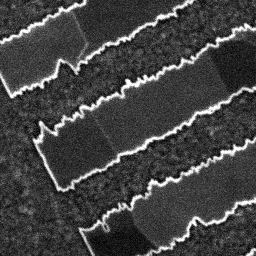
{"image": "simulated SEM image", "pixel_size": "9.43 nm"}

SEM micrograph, one or a few lines or trenches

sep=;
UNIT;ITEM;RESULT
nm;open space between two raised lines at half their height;414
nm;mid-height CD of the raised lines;526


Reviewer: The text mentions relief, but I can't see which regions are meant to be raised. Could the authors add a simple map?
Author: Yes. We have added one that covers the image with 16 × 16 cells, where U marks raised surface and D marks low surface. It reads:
DDDDUUUUUUUDDDDD
DDUUUUUUUDDDDDDD
UUUUUUUUDDDDDDUU
UUUUUUDDDDDDUUUU
UUUUDDDDDDUUUUUU
UUDDDDDDUUUUUUUU
DDDDDDUUUUUUUUDD
DDDDUUUUUUUUDDDD
DDUUUUUUUUDDDDDD
DDUUUUUUDDDDDDUU
DDDUUUUDDDDDUUUU
DDDUUDDDDDUUUUUU
DDDDDDDDUUUUUUUU
DDDDDDDUUUUUUUDD
DDDDDUUUUUUUDDDD
DDDDDDUUUUDDDDDD